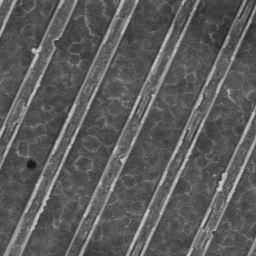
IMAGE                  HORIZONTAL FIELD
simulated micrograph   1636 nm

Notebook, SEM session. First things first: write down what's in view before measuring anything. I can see parallel lines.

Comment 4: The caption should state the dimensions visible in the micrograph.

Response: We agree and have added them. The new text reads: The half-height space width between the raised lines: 259 nm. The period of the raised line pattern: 354 nm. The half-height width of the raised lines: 95 nm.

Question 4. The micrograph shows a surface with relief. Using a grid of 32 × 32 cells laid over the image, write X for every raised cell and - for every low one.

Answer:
XX-----XX------XX------XX-----XX
X------XX------XX-----XX------XX
X-----XX------XX------XX-----XX-
X-----XX------XX-----XX------XX-
------X------XX------XX-----XX--
-----XX------XX-----XX------XX--
----XXX-----XX------XX-----XXX--
----XX------XX-----XX------XX---
----XX-----XX------XX------XX---
---XX------XX-----XX------XX----
---XX-----XX------XX------XX----
--XX------XX------XX-----XX-----
--XX-----XX------XX------XX-----
-XX------XX------XX-----XX------
-XX------XX-----XX------XX-----X
XX------XX------XX-----XX------X
XX------XX-----XX------XX-----XX
XX-----XX------XX-----XX------XX
X------XX-----XX------XX------XX
X-----XX------XX-----XXX-----XX-
------XX------X------XX------XX-
-----XX------XX------XX-----XX--
-----XX------X------XX------XX--
----XXX-----XX------XX-----XX---
----XX------XX-----XX------XX---
---XXX-----XX------XX-----XX----
---XX------XX-----XX------XX----
---XX-----XX------XX-----XX-----
--XX------XX-----XX------XX-----
--XX-----XX------XX-----XX------
-XX------XX-----XX------XX------
-XX-----XX------XX------XX-----X